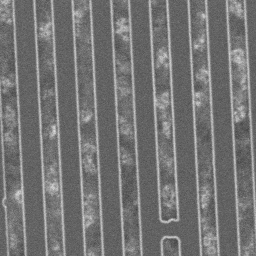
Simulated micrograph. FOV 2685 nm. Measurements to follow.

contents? parallel lines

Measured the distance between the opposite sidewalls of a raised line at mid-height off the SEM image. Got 223 nm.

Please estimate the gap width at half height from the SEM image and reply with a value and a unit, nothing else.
0.182 µm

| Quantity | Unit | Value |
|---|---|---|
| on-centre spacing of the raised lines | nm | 404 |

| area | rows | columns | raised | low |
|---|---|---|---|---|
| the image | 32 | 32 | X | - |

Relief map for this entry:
--XX---XX--XXX--XXX--XXX--XX---X
--XX---XX--XXX--XXX--XXX--XX---X
--XX---XX--XXX--XXX--XXX--XX---X
--XX---XX--XXX--XXX--XXX--XX---X
--XX---XX---XX--XXX--XXX--XXX--X
--XXX--XX---XX--XXX--XXX--XXX--X
--XXX--XX---XX--XXX--XXX--XXX--X
--XXX--XX---XX--XXX--XXX--XXX--X
--XXX--XX---XX---XX--XXX--XXX--X
--XXX--XXX--XX---XX--XXX--XXX--X
--XXX--XXX--XX---XX--XXX--XXX--X
--XXX--XXX--XX---XX---XX--XXX--X
--XXX--XXX--XX---XX---XX--XXX--X
--XXX--XXX--XXX--XX---XX--XXX--X
--XXX--XXX--XXX--XX---XX--XXX--X
--XXX--XXX--XXX--XX---XX---XX--X
--XXX--XXX--XXX--XXX--XX---XX--X
---XX--XXX--XXX--XXX--XX---XX--X
---XX--XXX--XXX--XXX--XX---XX--X
---XX--XXX--XXX--XXX--XX---XX---
---XX---XX--XXX--XXX--XXX--XX---
---XX---XX--XXX--XXX--XXX--XX---
X--XX---XX--XXX--XXX--XXX--XX---
X--XX---XX--XXX--XXX--XXX--XX---
X--XX---XX---XX--XXX--XXX--XXX--
X--XXX--XX---XX--XXX--XXX--XXX--
X--XXX--XX---XX--XXX--XXX--XXX--
X--XXX--XX---XX--XXX-XXXX--XXX--
X--XXX--XX---XX---XXXXXXX--XXX--
X--XXX--XXX--XX---XXXXXXX--XXX--
X--XXX--XXX--XX---XX--XXX--XXX--
X--XXX--XXX--XX---XX---XX--XXX--